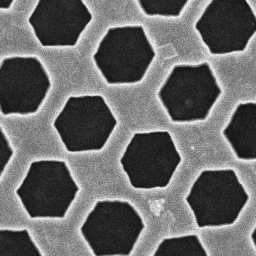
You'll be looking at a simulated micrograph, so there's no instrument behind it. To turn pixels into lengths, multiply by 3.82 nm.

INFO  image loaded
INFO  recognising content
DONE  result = holes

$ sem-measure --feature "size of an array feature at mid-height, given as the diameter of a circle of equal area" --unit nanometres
219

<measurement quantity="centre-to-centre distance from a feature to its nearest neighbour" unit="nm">289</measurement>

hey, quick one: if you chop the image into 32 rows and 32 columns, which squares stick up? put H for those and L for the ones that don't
LHHHHLLLLLLHHHHHHHLLLLLHHHLLLLLH
HHHHLLLLLLLHHHHHHHLLLLLHHHLLLLLL
HHHHLLLLLLLHHHHHHHHHHHHHHLLLLLLL
HHHHLLLLLLLHHHLLLLHHHHHHHLLLLLLL
HHHHHLLLLLHHHLLLLLHHHHHHHLLLLLLH
HHHHHLLLLHHHLLLLLLLHHHHHHHLLLLLH
HHHHHHHHHHHHLLLLLLLHHHHHHHLLLHHH
HLLLLHHHHHHHLLLLLLLHHHHHHHHHHHHH
LLLLLHHHHHHHLLLLLLHHHHLLLLHHHHHH
LLLLLLHHHHHHHLLLLLHHHLLLLLLHHHHH
LLLLLLHHHHHHHHHHHHHHHLLLLLLHHHHH
LLLLLLHHHHHHHHHHHHHHLLLLLLLHHHHH
LLLLLHHHHLLLLHHHHHHHLLLLLLLHHHHH
LLLLLHHHLLLLLLHHHHHHHLLLLLHHHHLL
HHHHHHHLLLLLLLHHHHHHHLLLLLHHHLLL
HHHHHHHLLLLLLLHHHHHHHHHHHHHHHLLL
HHHHHHHLLLLLLLHHHHHLLHHHHHHHLLLL
LHHHHHHHLLLLLHHHLLLLLHHHHHHHHLLL
LHHHHHHHLLLLLHHHLLLLLLHHHHHHHLLL
LHHHHHHHHHHHHHHLLLLLLLHHHHHHHHLL
LHHHLLLLHHHHHHHLLLLLLLHHHHHHHHHH
HHHHLLLLLHHHHHHHLLLLLLHHHLLLLHHH
HHHLLLLLLHHHHHHHLLLLLHHHHLLLLLHH
HHLLLLLLLLHHHHHHHHLHHHHHLLLLLLHH
HHLLLLLLLHHHHHHHHHHHHHHHLLLLLLLH
HHHLLLLLLHHHLLLLHHHHHHHHLLLLLLLH
HHHLLLLLHHHLLLLLLHHHHHHHLLLLLLHH
HHHHHHHHHHHLLLLLLLHHHHHHHLLLLHHH
HHHHHHHHHHLLLLLLLLHHHHHHHHHHHHHH
LLLLHHHHHHLLLLLLLHHHHHHLHHHHHHHL
LLLLHHHHHHHLLLLLLHHHLLLLLHHHHHHH
LLLLLHHHHHHHLLLLHHHLLLLLLLHHHHHH